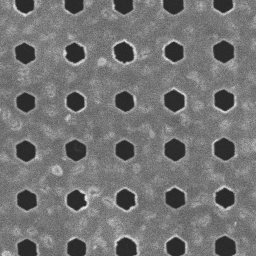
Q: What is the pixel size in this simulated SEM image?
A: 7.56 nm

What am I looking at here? a regular array of holes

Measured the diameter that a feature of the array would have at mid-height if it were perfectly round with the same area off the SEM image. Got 150 nanometres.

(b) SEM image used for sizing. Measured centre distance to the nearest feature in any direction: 369 nanometres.